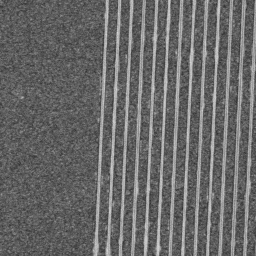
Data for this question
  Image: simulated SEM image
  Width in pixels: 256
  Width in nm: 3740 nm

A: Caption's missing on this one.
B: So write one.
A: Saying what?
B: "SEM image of parallel lines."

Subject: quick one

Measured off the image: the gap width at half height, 10.1 pixels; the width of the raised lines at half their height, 36.5 nanometres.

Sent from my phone